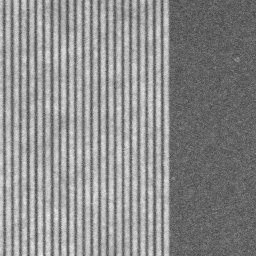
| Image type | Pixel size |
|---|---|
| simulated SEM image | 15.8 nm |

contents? parallel lines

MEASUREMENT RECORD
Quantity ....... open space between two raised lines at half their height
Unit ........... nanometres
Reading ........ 51.5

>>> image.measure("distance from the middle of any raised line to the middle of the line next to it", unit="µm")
0.125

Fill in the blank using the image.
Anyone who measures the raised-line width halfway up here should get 75.3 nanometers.